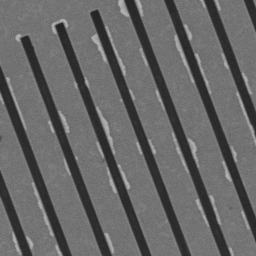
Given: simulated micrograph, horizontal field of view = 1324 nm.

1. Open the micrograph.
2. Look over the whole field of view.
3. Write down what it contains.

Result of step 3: parallel lines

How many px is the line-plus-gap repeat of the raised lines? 37.1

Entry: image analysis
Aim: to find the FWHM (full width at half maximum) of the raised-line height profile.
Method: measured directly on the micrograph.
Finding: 146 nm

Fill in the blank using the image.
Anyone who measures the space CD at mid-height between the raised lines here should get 47.2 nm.